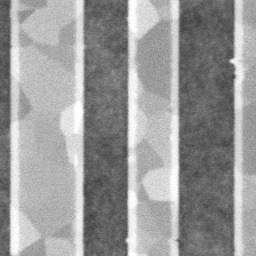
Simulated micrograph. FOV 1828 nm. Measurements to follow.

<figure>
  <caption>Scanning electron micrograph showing one or a few lines or trenches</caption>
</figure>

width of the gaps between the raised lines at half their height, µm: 0.397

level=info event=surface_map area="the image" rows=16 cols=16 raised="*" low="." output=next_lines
.****...***....*
.****...***....*
.****...***....*
.****...***....*
.****...***....*
.****...***....*
.****...***....*
.****...***....*
.****...***....*
.****...***....*
.****...***....*
.****...***....*
.****...***....*
.****...***....*
.****...***....*
.****...***....*